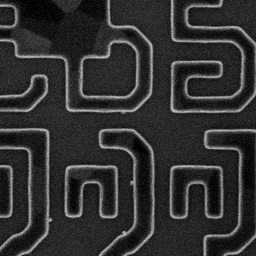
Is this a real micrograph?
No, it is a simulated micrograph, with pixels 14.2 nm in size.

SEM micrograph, wiring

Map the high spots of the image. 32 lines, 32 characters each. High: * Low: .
**************.......*******....
..************.......**.........
..************.......**.........
*****************....*********..
******************....*********.
..************..***..........***
..************...**...........**
........**.......**...........**
........**.......**..*******..**
....*...**.......**..******...**
....**..**.......**..**.......**
...***..**.......**..**.......**
*****...**********...**********.
****....*********....*********..
................................
................................
******.......****.........******
******.......*****........******
.*****........*****.......******
....**...........**...........**
....**...........**...........**
*...**..*******..**..*******..**
*...**..*******..**..*******..**
*...**..**...**..**..***..**..**
*...**..**...**..**..**...**..**
*...**..**...**..**..**...**..**
*...**..**...**..**..**...**..**
....**...........**...........**
...***..........***...........**
..****.........****.......******
*****.........****........*****.
***..........****.........****..